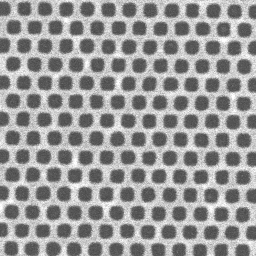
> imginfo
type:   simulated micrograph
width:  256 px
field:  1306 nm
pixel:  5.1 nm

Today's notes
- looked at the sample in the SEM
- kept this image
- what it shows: a regular array of holes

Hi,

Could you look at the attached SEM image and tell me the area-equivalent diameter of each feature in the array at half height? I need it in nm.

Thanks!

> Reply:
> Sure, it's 81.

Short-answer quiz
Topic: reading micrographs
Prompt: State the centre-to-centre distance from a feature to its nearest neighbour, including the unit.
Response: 20.8 px